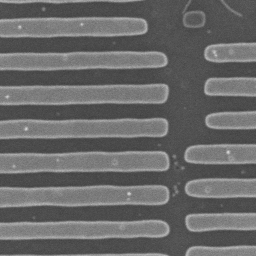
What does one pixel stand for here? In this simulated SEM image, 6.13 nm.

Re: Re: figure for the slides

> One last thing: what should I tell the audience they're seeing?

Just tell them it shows wiring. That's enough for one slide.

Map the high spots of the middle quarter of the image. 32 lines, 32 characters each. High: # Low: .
#########################.......
................................
................................
................................
................................
..........################......
##########################......
##########################......
##########################......
#########################.......
................................
................................
................................
................................
##########################......
##########################......
##########################......
##########################......
................................
................................
................................
...............................#
##########################....##
##########################....##
##########################.....#
##########################......
#########################.......
................................
................................
...............................#
........####........#####.....##
##########################....##